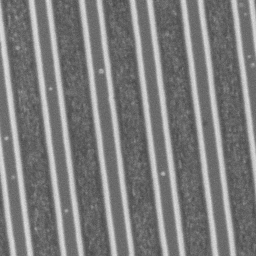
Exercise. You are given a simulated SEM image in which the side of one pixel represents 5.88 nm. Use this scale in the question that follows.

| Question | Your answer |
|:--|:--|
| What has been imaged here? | parallel lines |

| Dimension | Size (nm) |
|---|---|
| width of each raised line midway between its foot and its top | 109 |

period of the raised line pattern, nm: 296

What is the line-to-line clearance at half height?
0.184 um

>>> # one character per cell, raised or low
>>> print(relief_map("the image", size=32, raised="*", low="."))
....**....***....**....**....***
....**....***....**....**....***
....**....***....**....**....***
....***....**....**....***....**
....***....**....**....***....**
....***....**....***...***....**
*....**....**....***....**....**
*....**....**....***....**....**
*....**....***....**....**....**
*....**....***....**....**....**
*....**.....**....**....**.....*
*....***....**....**....***....*
*....***....**....**....***....*
**....**....**....***....**....*
**....**....**....***....**....*
**....**....**....***....**....*
**....**....***....**....**....*
**....**....***....**....**....*
**....***...***....**....***....
**....***....**....**....***....
**....***....**....**....***....
***....**....**....***....**....
***....**....**....***....**....
.**....**....***...***....**....
.**....**....***....**....**....
.**....**....***....**....**....
.**....***...***....**....**....
.**....***....**....**....***...
.**....***....**....**.....**...
.***....**....**....***....**...
.***....**....**....***....**...
..**....**....***....**....**...